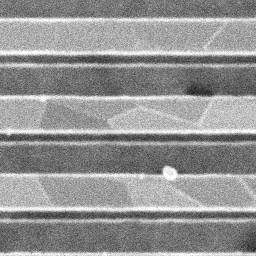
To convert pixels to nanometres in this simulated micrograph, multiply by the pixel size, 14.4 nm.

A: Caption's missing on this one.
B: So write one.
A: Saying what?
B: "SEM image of lines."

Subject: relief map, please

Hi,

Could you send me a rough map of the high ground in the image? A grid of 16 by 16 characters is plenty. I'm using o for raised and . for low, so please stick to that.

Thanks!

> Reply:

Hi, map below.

................
oooooooooooooooo
oooooooooooooooo
................
................
................
oooooooooooooooo
oooooooooooooooo
................
................
................
oooooooooooooooo
oooooooooooooooo
................
................
................